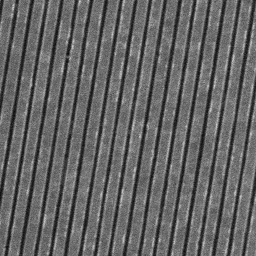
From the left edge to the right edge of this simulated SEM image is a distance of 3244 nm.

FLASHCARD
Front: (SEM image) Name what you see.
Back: parallel lines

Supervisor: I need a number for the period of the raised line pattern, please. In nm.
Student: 186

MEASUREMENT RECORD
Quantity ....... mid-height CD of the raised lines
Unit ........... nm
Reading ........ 130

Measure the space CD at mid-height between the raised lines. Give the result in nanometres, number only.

59.4